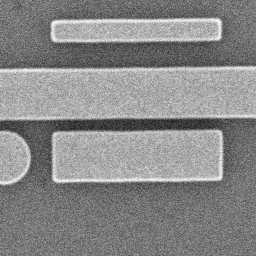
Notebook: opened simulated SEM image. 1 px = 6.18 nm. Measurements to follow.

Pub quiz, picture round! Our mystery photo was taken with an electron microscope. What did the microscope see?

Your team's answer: groups of lines, slits or small figures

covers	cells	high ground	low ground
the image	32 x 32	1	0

00000000000000000000000000000000
00000000000000000000000000000000
00000000000000000000000000000000
00000001111111111111111111110000
00000001111111111111111111100000
00000000000000000000000000000000
00000000000000000000000000000000
00000000000000000000000000000000
00000000000000000000000000011111
11111111111111111111111111111111
11111111111111111111111111111111
11111111111111111111111111111111
11111111111111111111111111111111
11111111111111111111111111111111
11111111111111111111111111111111
00000000000000000000000000000000
00000000000000000000111111100000
11100001111111111111111111110000
11100001111111111111111111110000
11110001111111111111111111110000
11110001111111111111111111110000
11100001111111111111111111110000
11000001111111111000110000000000
00000000000000000000000000000000
00000000000000000000000000000000
00000000000000000000000000000000
00000000000000000000000000000000
00000000000000000000000000000000
00000000000000000000000000000000
00000000000000000000000000000000
00000000000000000000000000000000
00000000000000000000000000000000